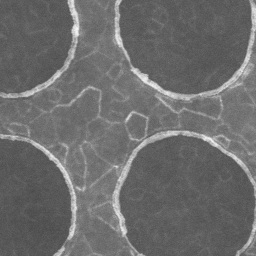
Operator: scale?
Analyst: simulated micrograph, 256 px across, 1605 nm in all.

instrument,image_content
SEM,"holes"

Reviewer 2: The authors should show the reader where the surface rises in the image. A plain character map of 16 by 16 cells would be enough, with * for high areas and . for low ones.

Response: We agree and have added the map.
....***.........
.....**.........
.....***........
....****.......*
....*****......*
..********....**
****************
****************
**********..****
...******.....**
....****.......*
....****........
....***.........
....****........
....****........
....****.......*